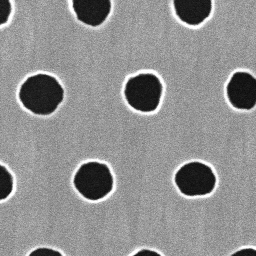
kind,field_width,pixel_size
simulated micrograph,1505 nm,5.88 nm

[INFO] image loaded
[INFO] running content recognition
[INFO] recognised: holes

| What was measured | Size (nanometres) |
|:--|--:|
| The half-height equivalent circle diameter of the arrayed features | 222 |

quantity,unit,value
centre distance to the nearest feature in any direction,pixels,101